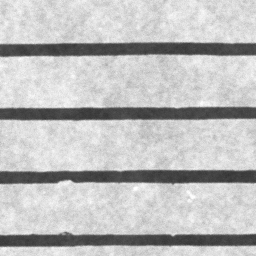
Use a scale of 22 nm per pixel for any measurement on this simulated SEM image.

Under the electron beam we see one or a few lines or trenches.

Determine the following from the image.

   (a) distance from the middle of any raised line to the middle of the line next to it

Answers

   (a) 1400 nanometers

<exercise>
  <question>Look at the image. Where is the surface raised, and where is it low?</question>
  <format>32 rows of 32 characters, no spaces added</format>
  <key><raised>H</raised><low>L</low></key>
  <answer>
HHHHHHHHHHHHHHHHHHHHHHHHHHHHHHHH
HHHHHHHHHHHHHHHHHHHHHHHHHHHHHHHH
HHHHHHHHHHHHHHHHHHHHHHHHHHHHHHHH
HHHHHHHHHHHHHHHHHHHHHHHHHHHHHHHH
HHHHHHHHHHHHHHHHHHHHHHHHHHHHHHHH
LLLLLLLLLLLLLLLLLLLLLLLLLLLLLLLL
LLLLLLLLLLLLLLLLLLLLLLLLLLLLLLLL
HHHHHHHHHHHHHHHHHHHHHHHHHHHHHHHH
HHHHHHHHHHHHHHHHHHHHHHHHHHHHHHHH
HHHHHHHHHHHHHHHHHHHHHHHHHHHHHHHH
HHHHHHHHHHHHHHHHHHHHHHHHHHHHHHHH
HHHHHHHHHHHHHHHHHHHHHHHHHHHHHHHH
HHHHHHHHHHHHHHHHHHHHHHHHHHHHHHHH
LLLLLLLLLLLLLLLLLLLLLLLLLLLLLLLL
LLLLLLLLLLLLLLLLLLLLLLLLLLLLLLLL
HHHHHHHHHHHHHHHHHHHHHHHHHHHHHHHH
HHHHHHHHHHHHHHHHHHHHHHHHHHHHHHHH
HHHHHHHHHHHHHHHHHHHHHHHHHHHHHHHH
HHHHHHHHHHHHHHHHHHHHHHHHHHHHHHHH
HHHHHHHHHHHHHHHHHHHHHHHHHHHHHHHH
HHHHHHHHHHHHHHHHHHHHHHHHHHHHHHHH
LLLLLLLLLLLLLLLLLLLLLLLLLLLLLLLL
LLLLLLLLLLLLLLLLLLLLLLLLLLLLLLLL
HHHHHHHHHHHHHHHHHHHHHHHHHHHHHHHH
HHHHHHHHHHHHHHHHHHHHHHHHHHHHHHHH
HHHHHHHHHHHHHHHHHHHHHHHHHHHHHHHH
HHHHHHHHHHHHHHHHHHHHHHHHHHHHHHHH
HHHHHHHHHHHHHHHHHHHHHHHHHHHHHHHH
HHHHHHHHHHHHHHHHHHHHHHHHHHHHHHHH
LLLLLLLLLLLLLLLLLLLLLLLLLLLLLLLL
LLLLLLLLLLLLLLLLLLLLLLLLLLLLLLLL
HHHHHHHHHHHHHHHHHHHHHHHHHHHHHHHH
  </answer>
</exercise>